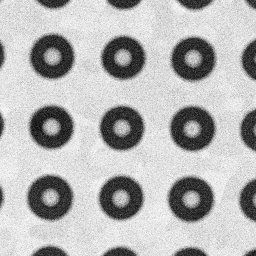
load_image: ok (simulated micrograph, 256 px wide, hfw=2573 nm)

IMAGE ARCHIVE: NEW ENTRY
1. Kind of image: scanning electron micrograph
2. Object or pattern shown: an array of small figures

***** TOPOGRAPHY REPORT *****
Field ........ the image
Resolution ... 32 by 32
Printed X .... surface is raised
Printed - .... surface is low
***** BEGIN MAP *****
XXXXX----XXXXX----XXXX----XXXXX-
XXXXXXXXXXXXXXXXXXXXXXXXXXXXXXXX
XXXXXXXXXXXXXXXXXXXXXXXXXXXXXXXX
XXXXXXXXXXXXXXXXXXXXXXXXXXXXXXXX
XXXXX---XXXXXXX-XXXXXXXX-XXXXXXX
XXXX-----XXXX-----XXXX----XXXXX-
-XXX--X--XXXX--X--XXX------XXX--
-XXX--X--XXXX--X--XXX--XX--XXX--
XXXX-----XXXX-----XXX------XXX--
XXXXX---XXXXXX---XXXXX----XXXXX-
XXXXXXXXXXXXXXXXXXXXXXXXXXXXXXXX
XXXXXXXXXXXXXXXXXXXXXXXXXXXXXXXX
XXXXXXXXXXXXXXXXXXXXXXXXXXXXXXXX
XXXXX---XXXXXX---XXXXXX--XXXXXXX
XXXX-----XXXX-----XXXX-----XXXX-
-XXX--X--XXX---X--XXX------XXX--
-XXX--X--XXX---X--XXX--XX--XXX--
XXXX-----XXXX-----XXXX-----XXX--
XXXXX---XXXXXX---XXXXX----XXXXX-
XXXXXXXXXXXXXXXXXXXXXXXXXXXXXXXX
XXXXXXXXXXXXXXXXXXXXXXXXXXXXXXXX
XXXXXXXXXXXXXXXXXXXXXXXXXXXXXXXX
XXXX----XXXXX----XXXXX----XXXXX-
XXXX-----XXXX-----XXX------XXX--
-XX---X--XXX--XX--XXX--X---XXX--
XXX------XXX------XXX------XXX--
XXXX-----XXXX----XXXX-----XXXX--
XXXXX--XXXXXXX--XXXXXX---XXXXXX-
XXXXXXXXXXXXXXXXXXXXXXXXXXXXXXXX
XXXXXXXXXXXXXXXXXXXXXXXXXXXXXXXX
XXXXXXXXXXXXXXXXXXXXXXXXXXXXXXXX
XXXX----XXXXX----XXXXX----XXXXX-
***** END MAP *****